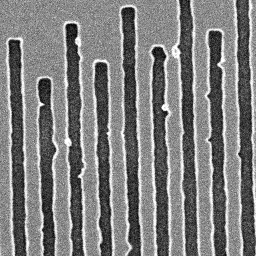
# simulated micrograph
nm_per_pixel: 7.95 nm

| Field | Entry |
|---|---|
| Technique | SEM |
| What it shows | parallel lines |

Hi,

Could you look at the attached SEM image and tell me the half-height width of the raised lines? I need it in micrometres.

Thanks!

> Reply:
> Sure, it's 0.122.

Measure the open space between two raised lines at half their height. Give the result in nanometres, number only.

106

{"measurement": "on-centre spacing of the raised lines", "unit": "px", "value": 28.5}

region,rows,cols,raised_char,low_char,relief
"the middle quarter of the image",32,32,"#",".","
....###....###....####...####...
....###....####...####...####...
#...####...####...####...####...
#...####...####...####...####...
#...####...####...####....###...
#...###....####...####....###...
....####...####...####...####...
....####...####...####...####...
#....###...####...####...####...
#....###...####...####...####...
#....###...####...####...####...
#...####...####...####...####...
#...####...####...####....###...
#...####...####...####....###...
#...####...####...####....###...
#...####...####...####....####..
#...####...####...####....####..
#...####...####...####...#####..
#...####...####....###...####...
##..####...####....###....###...
#...####...####....###....###...
#....###....###....###....###...
#....###....###....###....###...
#....###....###....###....###...
#....###...####....###....####..
#....###....###....###....####..
#....###....###....###....####..
#...####....####...###....####..
#...####....####...####...####..
#...####....####...####...###...
#...####....####...####...###...
##...####...####...####...###...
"